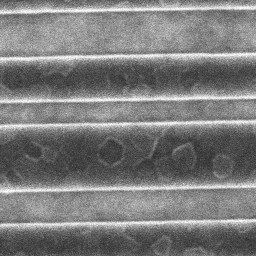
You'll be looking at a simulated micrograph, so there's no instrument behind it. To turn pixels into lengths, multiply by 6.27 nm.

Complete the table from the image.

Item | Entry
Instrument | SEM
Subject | one or a few lines or trenches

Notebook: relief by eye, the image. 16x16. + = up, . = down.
++++++++++++++++
................
................
.......+++++++++
++++++++++++++++
++++++++++++++++
................
................
++++++++++++++++
++++++++++++++++
++++++++++++++++
++++++++++++++++
................
................
++++++++++++++++
++++++++++++++++